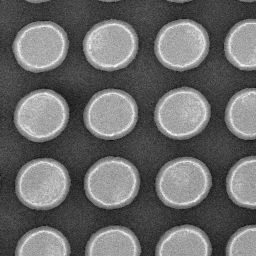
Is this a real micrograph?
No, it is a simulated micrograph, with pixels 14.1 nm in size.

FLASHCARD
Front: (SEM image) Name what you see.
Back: a regular array of raised bodies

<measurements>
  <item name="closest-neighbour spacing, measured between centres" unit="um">0.969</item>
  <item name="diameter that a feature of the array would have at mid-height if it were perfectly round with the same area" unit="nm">693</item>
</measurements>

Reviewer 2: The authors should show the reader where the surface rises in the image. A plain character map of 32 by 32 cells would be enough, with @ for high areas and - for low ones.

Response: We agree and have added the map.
--------------------------------
--------------------------------
--------------------------------
---@@@@-----@@@@-----@@@@----@@@
--@@@@@@---@@@@@@---@@@@@@---@@@
--@@@@@@---@@@@@@---@@@@@@--@@@@
--@@@@@@---@@@@@@---@@@@@@--@@@@
--@@@@@@---@@@@@----@@@@@----@@@
----@@-------@--------@---------
--------------------------------
--------------------------------
-------------@@-------@@------@@
---@@@@@----@@@@----@@@@@----@@@
--@@@@@@---@@@@@@---@@@@@@---@@@
--@@@@@@---@@@@@@---@@@@@@--@@@@
--@@@@@@---@@@@@@---@@@@@@---@@@
---@@@@-----@@@@-----@@@@----@@@
--------------------------------
--------------------------------
--------------------------------
----@@@-----@@@@-----@@@@-----@@
---@@@@@---@@@@@@---@@@@@@---@@@
--@@@@@@---@@@@@@---@@@@@@---@@@
--@@@@@@---@@@@@@---@@@@@@---@@@
--@@@@@@---@@@@@@---@@@@@----@@@
---@@@@-----@@@------@@@------@@
--------------------------------
--------------------------------
--------------@--------@-------@
---@@@@@----@@@@@----@@@@@---@@@
---@@@@@---@@@@@@---@@@@@@---@@@
--@@@@@@---@@@@@@---@@@@@@---@@@